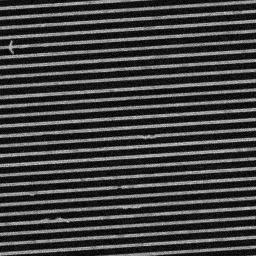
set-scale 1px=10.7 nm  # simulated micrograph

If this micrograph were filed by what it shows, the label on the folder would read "parallel lines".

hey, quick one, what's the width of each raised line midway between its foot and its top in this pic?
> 29.4 nanometers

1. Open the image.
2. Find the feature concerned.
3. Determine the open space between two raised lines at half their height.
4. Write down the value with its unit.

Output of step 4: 77.5 nm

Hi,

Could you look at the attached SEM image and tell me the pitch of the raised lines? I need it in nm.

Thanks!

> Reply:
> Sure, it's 105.